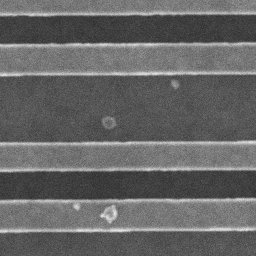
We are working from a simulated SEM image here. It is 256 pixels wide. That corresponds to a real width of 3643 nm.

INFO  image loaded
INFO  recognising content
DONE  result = lines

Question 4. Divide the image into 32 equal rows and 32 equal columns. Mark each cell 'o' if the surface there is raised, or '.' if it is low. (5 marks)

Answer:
oooooooooooooooooooooooooooooooo
oooooooooooooooooooooooooooooooo
................................
................................
................................
.........oo.oo.ooooooooooooooooo
oooooooooooooooooooooooooooooooo
oooooooooooooooooooooooooooooooo
oooooooooooooooooooooooooooooooo
................................
................................
................................
................................
................................
................................
................................
................................
................................
oooooooooooooooooooooooooooooooo
oooooooooooooooooooooooooooooooo
oooooooooooooooooooooooooooooooo
................................
................................
................................
................................
oooooooooooooooooooooooooooooooo
oooooooooooooooooooooooooooooooo
oooooooooooooooooooooooooooooooo
oooooooooooooooooooooooooooooooo
................................
................................
................................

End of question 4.